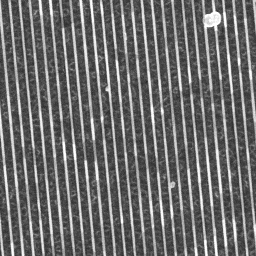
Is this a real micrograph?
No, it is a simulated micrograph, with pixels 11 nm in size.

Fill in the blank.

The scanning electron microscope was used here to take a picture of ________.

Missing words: parallel lines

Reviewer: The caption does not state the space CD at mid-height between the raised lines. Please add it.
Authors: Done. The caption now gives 92.9 nanometers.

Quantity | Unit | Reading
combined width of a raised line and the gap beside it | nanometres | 111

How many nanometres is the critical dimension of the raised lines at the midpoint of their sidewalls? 17.7